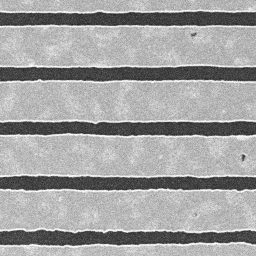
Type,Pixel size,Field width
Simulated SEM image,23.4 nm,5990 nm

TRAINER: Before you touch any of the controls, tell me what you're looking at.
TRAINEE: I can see parallel lines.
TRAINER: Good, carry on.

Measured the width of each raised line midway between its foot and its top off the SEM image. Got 933 nanometers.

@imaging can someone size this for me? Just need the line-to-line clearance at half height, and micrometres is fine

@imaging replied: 0.345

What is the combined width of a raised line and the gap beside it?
54.6 px